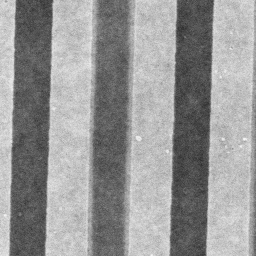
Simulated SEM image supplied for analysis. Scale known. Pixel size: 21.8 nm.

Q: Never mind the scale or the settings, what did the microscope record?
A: lines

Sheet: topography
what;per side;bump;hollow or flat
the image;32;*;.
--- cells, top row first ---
**.....*****.....*****.....*****
**.....*****.....*****.....*****
**.....*****.....*****.....*****
**.....*****.....*****.....*****
**.....****......*****.....*****
**.....****......*****.....*****
**.....****......*****.....*****
**....*****......*****.....*****
**....*****......*****.....*****
**....*****......*****.....*****
**....*****......*****.....*****
**....*****......*****....******
**....*****......*****....*****.
**....*****......*****....*****.
*.....*****......*****....*****.
*.....*****......*****....*****.
*.....*****.....******....*****.
*.....*****.....******....*****.
*.....*****.....******....*****.
*.....*****.....******....*****.
*.....*****.....*****.....*****.
*.....*****.....*****.....*****.
*.....*****.....*****.....*****.
*.....*****.....*****.....*****.
*.....*****.....*****.....*****.
*.....*****.....*****.....*****.
*.....*****.....*****.....*****.
*.....*****.....*****.....*****.
*.....*****.....*****.....*****.
*.....*****.....*****.....*****.
*.....*****.....*****.....*****.
*.....*****.....*****.....*****.